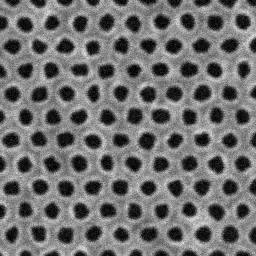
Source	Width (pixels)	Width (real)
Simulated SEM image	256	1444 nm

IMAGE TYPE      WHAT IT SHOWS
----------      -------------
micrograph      a regular array of holes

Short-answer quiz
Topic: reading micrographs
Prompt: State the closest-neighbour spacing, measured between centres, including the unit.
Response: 146 nm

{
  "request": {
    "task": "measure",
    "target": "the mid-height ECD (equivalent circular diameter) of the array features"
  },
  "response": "99.2 nm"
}